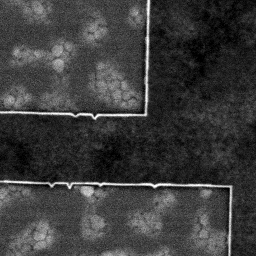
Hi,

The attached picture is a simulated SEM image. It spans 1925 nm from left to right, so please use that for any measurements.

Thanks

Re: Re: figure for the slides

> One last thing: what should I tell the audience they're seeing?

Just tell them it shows one or a few lines or trenches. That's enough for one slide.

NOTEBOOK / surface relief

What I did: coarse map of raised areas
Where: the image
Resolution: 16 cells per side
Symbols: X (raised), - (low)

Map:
---------XXXXXXX
---------XXXXXXX
---------XXXXXXX
---------XXXXXXX
---------XXXXXXX
---------XXXXXXX
---------XXXXXXX
XXXXXXXXXXXXXXXX
XXXXXXXXXXXXXXXX
XXXXXXXXXXXXXXXX
XXXXXXXXXXXXXXXX
----XXXXXXXXXXXX
--------------XX
--------------XX
--------------XX
--------------XX